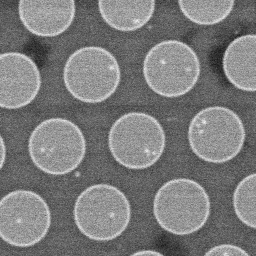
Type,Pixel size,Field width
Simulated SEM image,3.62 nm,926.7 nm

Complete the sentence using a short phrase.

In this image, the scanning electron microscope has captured an array of small figures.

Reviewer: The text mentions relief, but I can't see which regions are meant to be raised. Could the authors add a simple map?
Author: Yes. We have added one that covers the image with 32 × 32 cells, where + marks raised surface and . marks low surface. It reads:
..+++++++...+++++++...+++++++...
..+++++++....++++++....++++++...
...++++++....+++++......++++....
...+++++......+++...............
...............................+
....................+++......+++
.........++++......+++++....++++
++++.....+++++....+++++++...++++
+++++...+++++++...+++++++...++++
+++++...+++++++...+++++++...++++
+++++...+++++++....+++++.....+++
+++++....+++++......+++.........
++++......+++...................
..........................++....
...............++++......+++++..
.....++++.....++++++....++++++..
....++++++....++++++....++++++..
....++++++....+++++++...++++++..
....+++++++...++++++....++++++..
+...++++++....++++++.....++++...
....++++++.....++++.............
......++........................
......................++......++
...........+++......+++++.....++
.++++.....+++++.....++++++...+++
++++++....++++++...+++++++...+++
++++++...+++++++...+++++++...+++
++++++...+++++++....++++++....++
++++++....++++++.....++++.......
+++++......++++.................
.+++............................
.................++.......+++++.